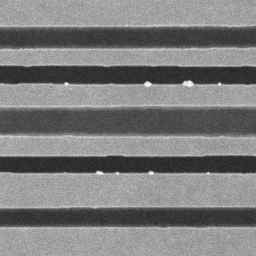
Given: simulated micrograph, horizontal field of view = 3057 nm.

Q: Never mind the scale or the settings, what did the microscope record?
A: lines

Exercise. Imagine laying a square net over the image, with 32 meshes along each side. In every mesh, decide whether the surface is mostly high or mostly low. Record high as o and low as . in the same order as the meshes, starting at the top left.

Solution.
oooooooooooooooooooooooooooooooo
oooooooooooooooooooooooooooooooo
oooooooooooooooooooooooooooooooo
................................
................................
................................
oooooooooooooooooooooooooooooooo
oooooooooooooooooooooooooooooooo
................................
................................
........o.........o....o........
oooooooooooooooooooooooooooooooo
oooooooooooooooooooooooooooooooo
................................
................................
................................
................................
oooooooooooooooooooooooooooooooo
oooooooooooooooooooooooooooooooo
................................
................................
............o...................
oooooooooooooooooooooooooooooooo
oooooooooooooooooooooooooooooooo
oooooooooooooooooooooooooooooooo
oooooooooooooooooooooooooooooooo
................................
................................
oooooooooooooooooooooooooooooooo
oooooooooooooooooooooooooooooooo
oooooooooooooooooooooooooooooooo
oooooooooooooooooooooooooooooooo